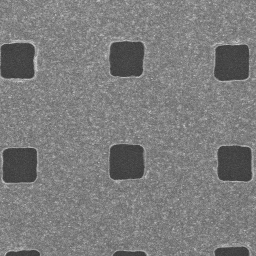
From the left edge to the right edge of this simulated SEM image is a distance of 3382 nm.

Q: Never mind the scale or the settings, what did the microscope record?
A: holes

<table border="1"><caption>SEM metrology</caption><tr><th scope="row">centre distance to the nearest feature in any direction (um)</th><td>1.36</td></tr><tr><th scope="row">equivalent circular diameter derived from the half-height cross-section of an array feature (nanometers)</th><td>512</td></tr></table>